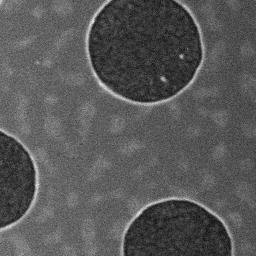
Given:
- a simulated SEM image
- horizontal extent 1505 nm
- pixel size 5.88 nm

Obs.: holes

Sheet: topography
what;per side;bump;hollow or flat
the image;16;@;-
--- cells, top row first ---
@@@@@@-----@@@@@
@@@@@@------@@@@
@@@@@@-------@@@
@@@@@@-------@@@
@@@@@@------@@@@
@@@@@@@----@@@@@
@@@@@@@@@@@@@@@@
@@@@@@@@@@@@@@@@
-@@@@@@@@@@@@@@@
--@@@@@@@@@@@@@@
--@@@@@@@@@@@@@@
--@@@@@@@@@@@@@@
--@@@@@@@@@@@@@@
-@@@@@@@@----@@@
@@@@@@@@------@@
@@@@@@@@------@@